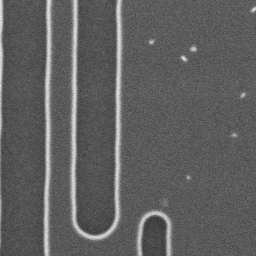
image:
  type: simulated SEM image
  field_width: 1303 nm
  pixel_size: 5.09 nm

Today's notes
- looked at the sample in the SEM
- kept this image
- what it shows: groups of lines, slits or small figures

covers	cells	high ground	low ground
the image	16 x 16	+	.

...++..+++++++++
...++..+++++++++
...++..+++++++++
...++..+++++++++
...++..+++++++++
...++..+++++++++
...++..+++++++++
...++..+++++++++
...++..+++++++++
...++..+++++++++
...++..+++++++++
...++..+++++++++
...++..+++++++++
...++..++.++++++
...++..++..+++++
...++++++..+++++